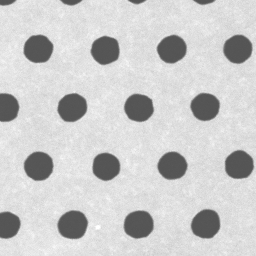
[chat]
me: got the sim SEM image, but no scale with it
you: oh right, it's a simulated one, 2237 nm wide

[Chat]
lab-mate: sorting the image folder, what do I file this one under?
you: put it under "a regular array of holes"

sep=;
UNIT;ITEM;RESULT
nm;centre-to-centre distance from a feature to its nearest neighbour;580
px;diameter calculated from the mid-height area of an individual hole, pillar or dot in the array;28.9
